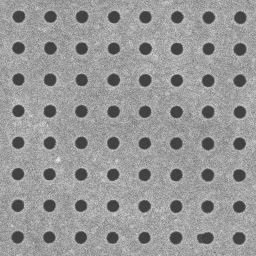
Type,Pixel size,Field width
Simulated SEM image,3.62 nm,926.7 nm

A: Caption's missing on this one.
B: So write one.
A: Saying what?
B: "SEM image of a regular array of holes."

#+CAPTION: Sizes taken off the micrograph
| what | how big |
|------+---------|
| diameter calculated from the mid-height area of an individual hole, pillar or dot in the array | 44.8 nanometres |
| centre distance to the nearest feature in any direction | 31.2 px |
